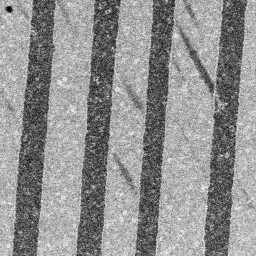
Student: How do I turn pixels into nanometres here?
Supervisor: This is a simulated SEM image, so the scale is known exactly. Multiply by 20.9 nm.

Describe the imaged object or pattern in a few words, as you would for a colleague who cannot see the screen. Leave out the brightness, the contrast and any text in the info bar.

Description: one or a few lines or trenches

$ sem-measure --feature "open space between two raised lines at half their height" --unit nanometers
790